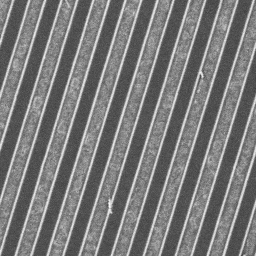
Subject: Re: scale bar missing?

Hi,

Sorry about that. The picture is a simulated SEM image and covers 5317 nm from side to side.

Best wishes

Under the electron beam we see parallel lines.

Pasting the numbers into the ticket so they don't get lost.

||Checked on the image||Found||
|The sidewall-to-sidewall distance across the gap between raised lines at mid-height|308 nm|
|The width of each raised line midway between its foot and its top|15.8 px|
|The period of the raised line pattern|0.636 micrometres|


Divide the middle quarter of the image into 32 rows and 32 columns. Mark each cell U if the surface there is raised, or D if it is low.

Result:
UUDDDDUUUUDDDDUUUUDDDDUUUUDDDDUU
UUDDDDUUUUDDDDUUUUDDDDUUUUDDDDUU
UUDDDDUUUUDDDDUUUUDDDDUUUUDDDDUU
UDDDDUUUUDDDDUUUUDDDDUUUUUDDDUUU
UDDDDUUUUDDDDUUUUDDDDUUUUDDDDUUU
UDDDDUUUUDDDDUUUUDDDDUUUUDDDDUUU
UDDDUUUUUDDDUUUUUDDDUUUUUDDDDUUU
DDDDUUUUDDDDUUUUDDDDUUUUDDDDUUUU
DDDDUUUUDDDDUUUUDDDDUUUUDDDDUUUU
DDDDUUUUDDDDUUUUDDDDUUUUDDDDUUUU
DDDUUUUDDDDUUUUDDDDUUUUDDDDUUUUD
DDDUUUUDDDDUUUUDDDDUUUUDDDDUUUUD
DDDUUUUDDDDUUUUDDDDUUUUDDDDUUUUD
DDUUUUDDDDUUUUDDDDUUUUDDDDUUUUDD
DDUUUUDDDDUUUUDDDDUUUUDDDDUUUUDD
DDUUUUDDDDUUUUDDDDUUUUDDDDUUUUDD
DUUUUDDDDUUUUUDDDUUUUUDDDUUUUUDD
DUUUUDDDDUUUUDDDDUUUUDDDDUUUUDDD
DUUUUDDDDUUUUDDDDUUUUDDDDUUUUDDD
UUUUUDDDUUUUUDDDDUUUUDDDDUUUUDDD
UUUUDDDDUUUUDDDDUUUUDDDDUUUUDDDD
UUUUDDDDUUUUDDDDUUUUDDDDUUUUDDDD
UUUUDDDDUUUUDDDDUUUUDDDDUUUUDDDU
UUUDDDDUUUUDDDDUUUUDDDDUUUUDDDDU
UUUDDDDUUUUDDDDUUUUDDDDUUUUDDDDU
UUUDDDDUUUUDDDDUUUUDDDDUUUUDDDDU
UUDDDDUUUUDDDDUUUUUDDDUUUUUDDDUU
UUDDDDUUUUDDDDUUUUDDDDUUUUDDDDUU
UUDDDDUUUUDDDDUUUUDDDDUUUUDDDDUU
UUDDDUUUUUDDDUUUUUDDDDUUUUDDDUUU
UDDDDUUUUDDDDUUUUDDDDUUUUDDDDUUU
UDDDDUUUUDDDDUUUUDDDDUUUUDDDDUUU